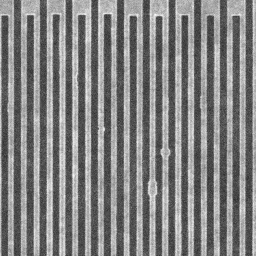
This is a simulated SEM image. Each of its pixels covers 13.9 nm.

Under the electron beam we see parallel lines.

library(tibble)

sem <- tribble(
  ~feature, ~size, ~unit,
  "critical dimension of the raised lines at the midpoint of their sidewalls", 0.0713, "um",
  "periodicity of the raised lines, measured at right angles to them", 0.179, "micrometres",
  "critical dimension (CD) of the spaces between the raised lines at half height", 108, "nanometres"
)